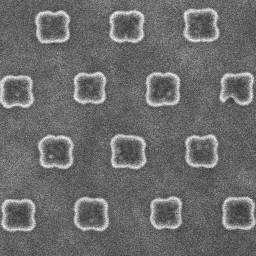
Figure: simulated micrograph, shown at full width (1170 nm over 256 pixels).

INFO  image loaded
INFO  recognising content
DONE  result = a regular array of raised bodies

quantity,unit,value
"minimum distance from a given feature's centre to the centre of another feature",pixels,71.9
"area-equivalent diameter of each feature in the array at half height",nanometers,154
